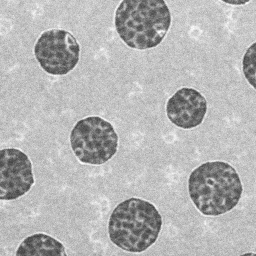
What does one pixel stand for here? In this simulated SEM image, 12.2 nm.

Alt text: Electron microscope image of holes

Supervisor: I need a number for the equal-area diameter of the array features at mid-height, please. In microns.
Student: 0.592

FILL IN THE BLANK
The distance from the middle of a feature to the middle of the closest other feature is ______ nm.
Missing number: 1080